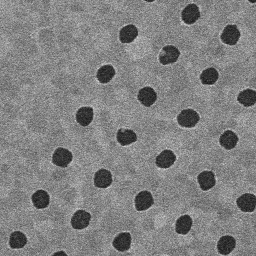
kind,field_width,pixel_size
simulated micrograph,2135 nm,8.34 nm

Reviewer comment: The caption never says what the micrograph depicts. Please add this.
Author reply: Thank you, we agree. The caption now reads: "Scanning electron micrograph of a regular array of holes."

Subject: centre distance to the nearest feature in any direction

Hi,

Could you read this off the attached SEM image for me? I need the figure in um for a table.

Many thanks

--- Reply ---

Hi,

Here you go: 0.382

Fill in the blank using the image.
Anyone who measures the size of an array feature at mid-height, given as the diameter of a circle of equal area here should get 19.7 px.